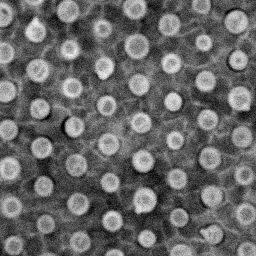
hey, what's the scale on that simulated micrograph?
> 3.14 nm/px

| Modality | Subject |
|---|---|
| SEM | a regular array of raised bodies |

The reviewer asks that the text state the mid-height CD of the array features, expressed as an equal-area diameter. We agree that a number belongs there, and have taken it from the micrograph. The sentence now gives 0.0597 µm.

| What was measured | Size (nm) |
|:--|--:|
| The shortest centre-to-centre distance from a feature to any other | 120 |